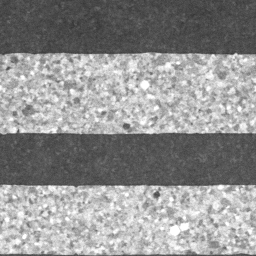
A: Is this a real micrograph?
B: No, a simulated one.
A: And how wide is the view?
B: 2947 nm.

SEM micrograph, one or a few lines or trenches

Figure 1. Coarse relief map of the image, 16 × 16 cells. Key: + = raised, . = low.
................
................
................
++++++++++++++++
++++++++++++++++
++++++++++++++++
++++++++++++++++
++++++++++++++++
................
................
................
................
++++++++++++++++
++++++++++++++++
++++++++++++++++
++++++++++++++++